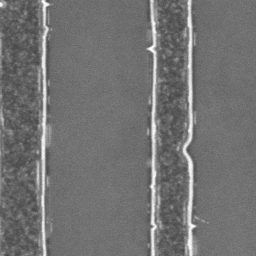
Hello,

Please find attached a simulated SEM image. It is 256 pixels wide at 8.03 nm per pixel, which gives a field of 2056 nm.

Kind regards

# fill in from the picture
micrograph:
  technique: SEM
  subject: one or a few lines or trenches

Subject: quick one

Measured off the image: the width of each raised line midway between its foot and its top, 304 nanometers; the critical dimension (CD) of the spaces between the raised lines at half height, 875 nanometres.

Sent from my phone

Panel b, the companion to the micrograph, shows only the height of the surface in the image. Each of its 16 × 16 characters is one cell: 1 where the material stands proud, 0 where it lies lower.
1110000001110000
1110000000110000
1110000000110000
1110000000110000
1110000000110000
1110000000110000
1110000000110000
1110000000110000
1110000000110000
1110000000110000
1110000000110000
1110000000110000
1110000000110000
1110000000110000
1110000000110000
1110000000110000